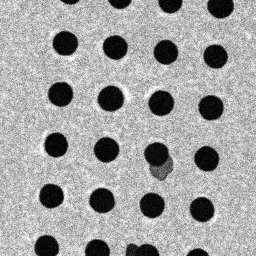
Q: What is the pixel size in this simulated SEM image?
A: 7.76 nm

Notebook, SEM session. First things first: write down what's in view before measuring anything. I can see a regular array of holes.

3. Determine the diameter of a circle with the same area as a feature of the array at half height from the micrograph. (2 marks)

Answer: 197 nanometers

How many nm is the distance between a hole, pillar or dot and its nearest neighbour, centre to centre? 390